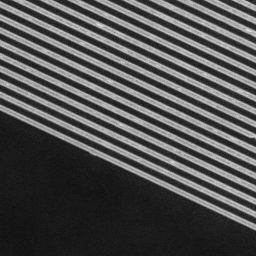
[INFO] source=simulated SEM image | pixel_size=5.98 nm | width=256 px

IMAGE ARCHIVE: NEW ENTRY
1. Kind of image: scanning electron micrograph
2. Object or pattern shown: parallel lines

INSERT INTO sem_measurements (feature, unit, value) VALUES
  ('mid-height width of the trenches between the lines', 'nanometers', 40.6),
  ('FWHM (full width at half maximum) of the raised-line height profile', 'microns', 0.0257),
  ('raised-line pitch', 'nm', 69.7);